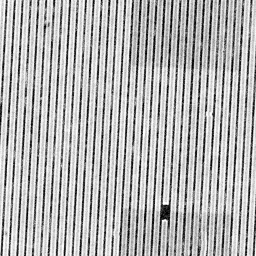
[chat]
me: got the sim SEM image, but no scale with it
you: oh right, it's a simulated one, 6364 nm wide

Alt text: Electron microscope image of parallel lines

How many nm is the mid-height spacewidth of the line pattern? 96.2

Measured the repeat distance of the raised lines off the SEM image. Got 0.196 um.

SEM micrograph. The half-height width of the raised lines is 96.2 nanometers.